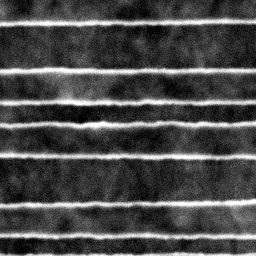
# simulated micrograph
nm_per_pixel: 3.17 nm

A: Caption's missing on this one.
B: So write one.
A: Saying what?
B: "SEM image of lines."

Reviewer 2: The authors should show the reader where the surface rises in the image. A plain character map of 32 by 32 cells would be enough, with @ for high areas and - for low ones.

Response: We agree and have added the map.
@@@@@@@@@@@@@@@@@@@@@@@@@@@@@@@@
@@@@@@@@@@@@@@@@@@@@@@@@@@@@@@@@
@@@@@@@@@@@@@@@@@@@@@@@@@@@@@@@@
--------------------------------
--------------------------------
--------------------------------
--------------------------------
--------------------------------
--------------------------------
@@@@@@@@@@@@@@@@@@@@@@@@@@@@@@@@
@@@@@@@@@@@@@@@@@@@@@@@@@@@@@@@@
@@@@@@@@@@@@@@@@@@@@@@@@@@@@@@@@
@@@@@@@@@@@@@@@@@@@@@@@@@@@@@@@@
--------------------------------
--------------------------------
----@@@@@--@@@--@@@@@@@@@@@@@@@@
@@@@@@@@@@@@@@@@@@@@@@@@@@@@@@@@
@@@@@@@@@@@@@@@@@@@@@@@@@@@@@@@@
@@@@@@@@@@@@@@@@@@@@@@@@@@@@@@@@
@@@@@@@@@@@@@@@@@@@@@@@@@@@@@@@@
--------------------------------
--------------------------------
--------------------------------
--------------------------------
--------------------------------
---@---@@@@@@@@@@@@@@@@@@@@@@@@@
@@@@@@@@@@@@@@@@@@@@@@@@@@@@@@@@
@@@@@@@@@@@@@@@@@@@@@@@@@@@@@@@@
@@@@@@@@@@@@@@@@@@@@@@@@@@@@@@@@
@@@@@@@@@@@@@@@@@@@@@@@@@@@@@@@@
--------------------------------
--------------------------------